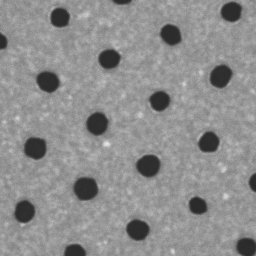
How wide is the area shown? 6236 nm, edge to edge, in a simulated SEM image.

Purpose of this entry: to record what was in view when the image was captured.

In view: a regular array of holes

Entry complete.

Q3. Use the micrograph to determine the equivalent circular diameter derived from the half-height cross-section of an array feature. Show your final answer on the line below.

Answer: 0.542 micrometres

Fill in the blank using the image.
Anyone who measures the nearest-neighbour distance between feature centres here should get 1570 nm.